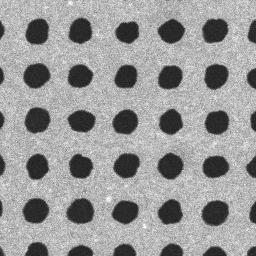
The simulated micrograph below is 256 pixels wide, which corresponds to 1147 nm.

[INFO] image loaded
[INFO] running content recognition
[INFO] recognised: a regular array of holes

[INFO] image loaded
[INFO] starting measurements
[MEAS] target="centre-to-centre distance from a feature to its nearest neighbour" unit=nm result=197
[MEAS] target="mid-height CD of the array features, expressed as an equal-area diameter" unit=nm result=111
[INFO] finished